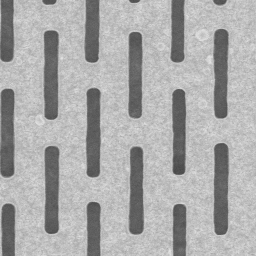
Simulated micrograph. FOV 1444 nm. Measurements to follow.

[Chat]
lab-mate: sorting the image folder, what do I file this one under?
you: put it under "a regular array of holes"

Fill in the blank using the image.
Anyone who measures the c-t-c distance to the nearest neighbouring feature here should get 402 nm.